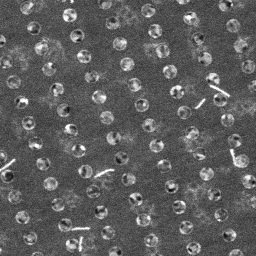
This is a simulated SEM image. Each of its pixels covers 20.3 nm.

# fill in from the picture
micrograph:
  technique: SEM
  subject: a regular array of raised bodies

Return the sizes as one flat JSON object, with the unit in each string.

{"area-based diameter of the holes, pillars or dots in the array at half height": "258 nm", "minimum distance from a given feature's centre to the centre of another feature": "439 nanometers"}